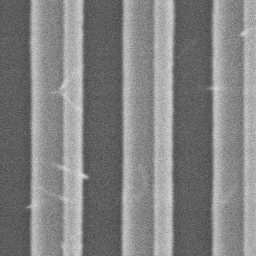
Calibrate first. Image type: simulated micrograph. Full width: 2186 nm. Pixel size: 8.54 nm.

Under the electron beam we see lines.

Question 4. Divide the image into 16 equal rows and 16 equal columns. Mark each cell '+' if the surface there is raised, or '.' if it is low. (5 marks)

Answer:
..+++...+++..+++
..+++...+++..+++
..+++...+++..+++
..+++...+++..+++
..+++...+++..+++
..+++...+++..+++
..+++...+++..+++
..+++...+++..+++
..+++...+++..+++
..+++...+++..+++
..+++...+++..+++
..+++...+++..+++
..+++...+++..+++
..+++...+++..+++
..+++...+++..+++
..+++...+++..+++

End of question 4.